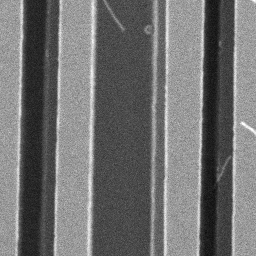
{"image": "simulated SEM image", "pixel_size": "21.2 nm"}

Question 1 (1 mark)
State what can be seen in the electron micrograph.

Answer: lines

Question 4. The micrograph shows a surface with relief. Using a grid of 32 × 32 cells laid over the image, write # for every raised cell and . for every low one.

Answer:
###.....####.........#####...###
###.....####.........#####...###
###....#####.........#####...###
###....#####.........####....###
###....#####.........####....###
###....#####.........####....###
###....#####.........####....###
###....#####.........####....###
###....#####.........####....###
###....#####.........####....###
###....#####.........####....###
###....#####.........####....###
###....#####.........####....###
###....#####.........####....###
###....#####.........####....###
##.....####..........####....###
##.....####..........####....###
##.....####..........####....###
##.....####..........####....###
##.....####..........####....###
##.....####..........####....###
##.....####..........####....###
##.....####..........####....###
##.....####..........####....###
##.....####..........####....###
##.....####..........####....###
##.....####..........####....###
##.....####..........####....###
##.....####..........####....###
##.....####..........####....###
##.....####..........####....###
##.....####..........####....###